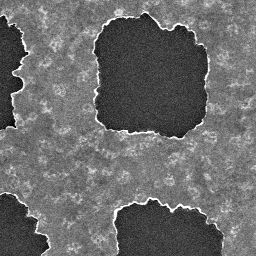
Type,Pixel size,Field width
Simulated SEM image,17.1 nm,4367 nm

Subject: holes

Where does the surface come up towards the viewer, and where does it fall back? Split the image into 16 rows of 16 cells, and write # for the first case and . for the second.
################
.######...######
.#####......####
..####.......###
.#####.......###
.#####.......###
.#####.......###
.#####.......###
##########.#####
################
################
################
.###############
..#####......###
...####.......##
...####.......##